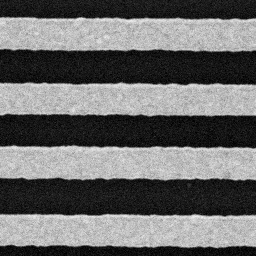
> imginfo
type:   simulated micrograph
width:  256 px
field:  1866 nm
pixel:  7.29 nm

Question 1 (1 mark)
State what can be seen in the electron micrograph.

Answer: lines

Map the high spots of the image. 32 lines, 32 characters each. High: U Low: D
DDDDDDDDDDDDDDDDDDDDDDDDDDDDDDDD
DDDDDDDDDDDDDDDDDDDDDDDDDDDDDDDD
UUUUUUUUUUUUUUUUDUUUUUUDDDUUDUDU
UUUUUUUUUUUUUUUUUUUUUUUUUUUUUUUU
UUUUUUUUUUUUUUUUUUUUUUUUUUUUUUUU
UUUUUUUUUUUUUUUUUUUUUUUUUUUUUUUU
DDDDDDDDDDDDDDDDDDDDDDDDDDDDDDDD
DDDDDDDDDDDDDDDDDDDDDDDDDDDDDDDD
DDDDDDDDDDDDDDDDDDDDDDDDDDDDDDDD
DDDDDDDDDDDDDDDDDDDDDDDDDDDDDDDD
DUDUDUDDDDDDDDDDDDDDDDDDDDDDDDDD
UUUUUUUUUUUUUUUUUUUUUUUUUUUUUUUU
UUUUUUUUUUUUUUUUUUUUUUUUUUUUUUUU
UUUUUUUUUUUUUUUUUUUUUUUUUUUUUUUU
DDDDDDDDDDDDDDDDDDDDDDDDDDDDDDDD
DDDDDDDDDDDDDDDDDDDDDDDDDDDDDDDD
DDDDDDDDDDDDDDDDDDDDDDDDDDDDDDDD
DDDDDDDDDDDDDDDDDDDDDDDDDDDDDDDD
UUUUUDUUUUUDDUUDDDDUUUDUDDDDDDDD
UUUUUUUUUUUUUUUUUUUUUUUUUUUUUUUU
UUUUUUUUUUUUUUUUUUUUUUUUUUUUUUUU
UUUUUUUUUUUUUUUUUUUUUUUUUUUUUUUU
DDDDDDDDDDDDDDDDDDDDDDDDDDDDDDDD
DDDDDDDDDDDDDDDDDDDDDDDDDDDDDDDD
DDDDDDDDDDDDDDDDDDDDDDDDDDDDDDDD
DDDDDDDDDDDDDDDDDDDDDDDDDDDDDDDD
DDDDDDDDDDDDDDDDDDDDDDDDDDDDDDDD
UUUUUUUUUUUUUUUUUUUUUUUUUUUUUUUU
UUUUUUUUUUUUUUUUUUUUUUUUUUUUUUUU
UUUUUUUUUUUUUUUUUUUUUUUUUUUUUUUU
UUUUUUUUUUUUUUUUUUUUUUUUUUUUUUUU
DDDDDDDDDDDDDDDDDDDDDDDDDDDDDDDD